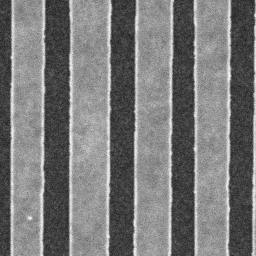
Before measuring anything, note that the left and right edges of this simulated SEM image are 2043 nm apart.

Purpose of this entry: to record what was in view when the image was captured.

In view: lines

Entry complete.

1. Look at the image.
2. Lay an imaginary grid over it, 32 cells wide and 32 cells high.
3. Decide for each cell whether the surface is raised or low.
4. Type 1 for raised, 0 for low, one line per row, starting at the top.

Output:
00111100011111000111110011111000
00111100011111000111110011111000
00111100011111000111110011111000
00111100011111000111110011111000
00111100011111000111110011111000
00111100011111000111110011111000
00111100011111000111110011111000
01111100011111000111110011111000
00111100011111000111100011111000
00111000011111000111100011111000
00111000011111000111100011111000
01111100011111000111100011111000
01111000011111000111100011111000
01111000011111000111100011111000
01111000011111000111100011111000
01111000011111000111100011111000
01111000011111000111100011111000
01111000011111000111100011111000
01111000011111000111100011111000
01111000011111000111100011111000
01111000011111000111100011111000
01111000011111000111100011111000
01111000011111000111100011111000
01111000011111000111100011111000
01111000011111000111100011111000
01111000011111000111100011111000
01111000011111000111100011111000
01111000011111000111100011111000
01111000011111000111100011111000
01111000011111000111100011111000
01111000011111000111100011111000
01111000011111000111100011111000